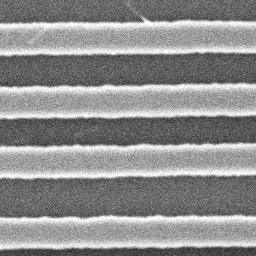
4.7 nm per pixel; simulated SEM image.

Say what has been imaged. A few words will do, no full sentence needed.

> lines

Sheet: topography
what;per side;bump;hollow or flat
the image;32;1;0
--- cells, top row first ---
00000000000000000000000000000000
00000000000000000000000000000000
00000000000000000000000000000000
11111111111111111111111111111111
11111111111111111111111111111111
11111111111111111111111111111111
11111111111111111111111111011111
00000000000000000000000000000000
00000000000000000000000000000000
00000000000000000000000000000000
00000000000000000000000000110110
11111111111111111111111111111111
11111111111111111111111111111111
11111111111111111111111111111111
11111111111111111011110000000000
00000000000000000000000000000000
00000000000000000000000000000000
00000000000000000000000000000000
11111111111111111111111111111111
11111111111111111111111111111111
11111111111111111111111111111111
11111111111111111111111111111111
00000000000000000000000000000000
00000000000000000000000000000000
00000000000000000000000000000000
00000000000000000000000000000000
00000000000000000000000000000000
11111111111111111111111111111111
11111111111111111111111111111111
11111111111111111111111111111111
11111111111111111111111111111111
00000000000000000000000000000000